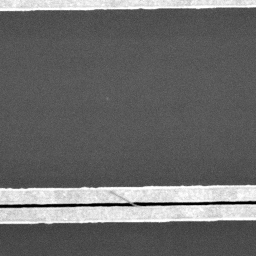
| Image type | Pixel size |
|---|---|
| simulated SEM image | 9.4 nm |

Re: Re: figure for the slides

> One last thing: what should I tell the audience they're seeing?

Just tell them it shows lines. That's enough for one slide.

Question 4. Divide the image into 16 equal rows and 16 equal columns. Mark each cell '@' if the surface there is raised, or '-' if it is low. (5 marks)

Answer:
@@@@@@@@@@------
----------------
----------------
----------------
----------------
----------------
----------------
----------------
----------------
----------------
----------------
----------------
@@@@@@@@@@@@@@@@
@@@@@@@@@@@@@@@@
----------------
----------------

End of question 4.